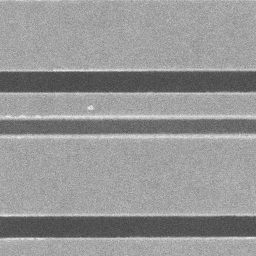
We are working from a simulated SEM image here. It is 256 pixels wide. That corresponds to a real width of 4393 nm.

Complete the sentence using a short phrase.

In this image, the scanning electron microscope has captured lines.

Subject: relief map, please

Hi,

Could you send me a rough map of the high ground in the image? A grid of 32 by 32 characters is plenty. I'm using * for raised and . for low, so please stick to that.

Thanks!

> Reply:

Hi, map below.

********************************
********************************
********************************
********************************
********************************
********************************
********************************
********************************
********************************
................................
................................
................................
********************************
********************************
********************************
................................
................................
********************************
********************************
********************************
********************************
********************************
********************************
********************************
********************************
********************************
********************************
................................
................................
................................
********************************
********************************